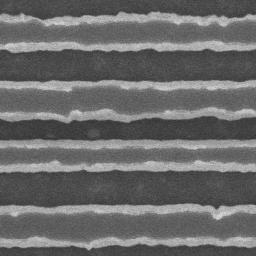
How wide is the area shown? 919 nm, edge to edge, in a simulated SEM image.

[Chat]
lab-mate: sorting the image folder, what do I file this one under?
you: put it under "one or a few lines or trenches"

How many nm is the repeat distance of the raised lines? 231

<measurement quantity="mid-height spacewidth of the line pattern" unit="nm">129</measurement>